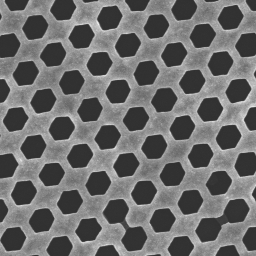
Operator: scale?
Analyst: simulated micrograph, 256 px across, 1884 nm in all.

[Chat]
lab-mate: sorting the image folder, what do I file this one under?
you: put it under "a regular array of holes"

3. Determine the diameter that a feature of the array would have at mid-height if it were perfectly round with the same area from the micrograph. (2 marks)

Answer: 180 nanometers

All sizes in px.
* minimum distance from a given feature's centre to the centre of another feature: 32.9